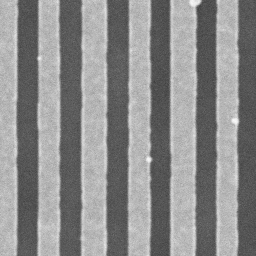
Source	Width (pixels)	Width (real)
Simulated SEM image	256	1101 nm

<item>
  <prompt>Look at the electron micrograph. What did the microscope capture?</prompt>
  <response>lines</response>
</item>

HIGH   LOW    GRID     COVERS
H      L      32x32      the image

HHLLLHHLLLHHHLLLHHHLLHHHHLLHHHLL
HHLLLHHLLLHHHLLLHHHLLHHHHLLHHHLL
HHLLLHHLLLHHHLLLHHHLLHHHHLLHHHLL
HHLLLHHLLLHHHLLLHHHLLHHHHLLHHHLL
HHLLLHHLLLHHHLLLHHHLLHHHLLLHHHLL
HHLLLHHLLLHHHLLLHHHLLHHHLLLHHHLL
HHLLLHHLLLHHHLLLHHHLLHHHHLLHHHLL
HHLLLHHLLLHHHLLLHHHLLHHHLLLHHHLL
HHLLLHHLLLHHHLLLHHHLLHHHLLLHHHLL
HHLLLHHLLLHHHLLLHHHLLHHHHLLHHHLL
HHLLLHHLLLHHHLLLHHHLLHHHHLLHHHLL
HHLLLHHLLLHHHLLLHHHLLHHHHLLHHHLL
HHLLLHHLLLHHHLLLHHHLLHHHLLLHHHLL
HHLLLHHLLLHHHLLLHHHLLHHHLLLHHHLL
HHLLLHHLLLHHHLLLHHHLLHHHLLLHHHLL
HHLLLHHLLLHHHLLLHHHLLHHHLLLHHHLL
HHLLLHHLLLHHHLLLHHHLLHHHLLLHHHLL
HHLLLHHLLLHHHLLLHHHLLHHHLLLHHHLL
HHLLLHHLLLHHHLLLHHHLLHHHLLLHHHLL
HHLLLHHLLLHHHLLLHHHLLHHHLLLHHHLL
HHLLLHHLLLHHHLLLHHHLLHHHLLLHHHLL
HHLLLHHLLLHHHLLLHHHLLHHHLLLHHHLL
HHLLLHHLLLHHHLLLHHHLLHHHLLLHHHLL
HHLLLHHLLLHHHLLLHHHLLHHHLLLHHHLL
HHLLLHHLLLHHHLLLHHHLLHHHLLLHHHLL
HHLLLHHLLLHHHLLLHHHLLHHHLLLHHHLL
HHLLLHHLLLHHHLLLHHHLLHHHLLLHHHLL
HHLLLHHLLLHHHLLLHHHLLHHHLLLHHHLL
HHLLLHHLLLHHHLLLHHHLLHHHLLLHHHLL
HHLLLHHLLLHHHLLLHHHLLHHHLLLHHHLL
HHLLLHHLLLHHHLLLHHHLLHHHLLLHHHLL
HHLLLHHLLLHHHLLLHHHLLHHHLLLHHHLL